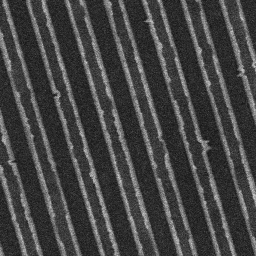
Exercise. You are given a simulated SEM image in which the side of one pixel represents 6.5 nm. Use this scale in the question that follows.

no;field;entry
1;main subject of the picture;parallel lines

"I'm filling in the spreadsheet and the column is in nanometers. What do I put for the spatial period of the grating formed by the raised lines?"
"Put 242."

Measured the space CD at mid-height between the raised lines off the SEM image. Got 127 nanometers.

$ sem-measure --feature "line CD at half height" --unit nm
116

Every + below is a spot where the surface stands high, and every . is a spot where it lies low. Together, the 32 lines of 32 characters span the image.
+..+++..+++..++...++...++...++..
+...++...++..+++..+++..++...++..
+...++...++...++..+++..+++..++..
++..+++..++...++...++...++...++.
++...++..+++..+++..++...++...++.
++...++...++...++..+++..+++..++.
+++..++...++...++...++...++..+++
.++..+++..+++..++...++...++...++
.++...++...++...++..+++..++...++
.++...++...++...++...++..+++..++
..++..+++..++...++...++...++...+
..++...++...++..+++..++...++...+
..++...++...++...++..+++..+++..+
..+++..+++..++...++...++...++..+
...++...++..+++..++...++...++...
...++...++...++...++..+++..++...
+..+++..++...++...++...++...++..
+...++..+++..++...++...++...++..
+...++...++...++..+++..+++..++..
++..++...++...++...++...++..+++.
++...++..+++..++...++...++...++.
++...++...++..+++..+++..++...++.
++...++...++...++...++..+++..+++
.++..+++..++...++...++...++...++
.++...++..+++..+++..++...++...++
.++...++...++...++...++..+++..++
.+++..++...++...++...++...++..++
..++...++..+++..++...++...++...+
..++...++...++...++..+++..++...+
..++...++...++...++...++..+++..+
...++..+++..+++..++...++...++...
...++...++...++..+++..++...++...